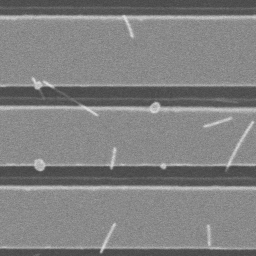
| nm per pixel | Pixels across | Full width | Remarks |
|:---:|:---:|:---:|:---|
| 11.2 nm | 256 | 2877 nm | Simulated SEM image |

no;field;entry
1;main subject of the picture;lines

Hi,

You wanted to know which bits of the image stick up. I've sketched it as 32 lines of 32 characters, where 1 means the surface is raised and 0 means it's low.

00000000000000000000000000000000
00000000000000000000000000000000
11111111111111111111111111111111
11111111111111111111111111111111
11111111111111111111111111111111
11111111111111111111111111111111
11111111111111111111111111111111
11111111111111111111111111111111
11111111111111111111111111111111
11111111111111111111111111111111
11111111111111111111111111111111
00000000000000000000000000000000
00000000000000000000000000000000
11111111111111111111111111111111
11111111111111111111111111111111
11111111111111111111111111111111
11111111111111111111111111111111
11111111111111111111111111111111
11111111111111111111111111111111
11111111111111111111111111111111
11111111111111111111111111111111
00000000000000000000000000000000
00000000000000000000000000000000
11111111111111111111111111111111
11111111111111111111111111111111
11111111111111111111111111111111
11111111111111111111111111111111
11111111111111111111111111111111
11111111111111111111111111111111
11111111111111111111111111111111
11111111111111111111111111111111
00000000000000000000000000000000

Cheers